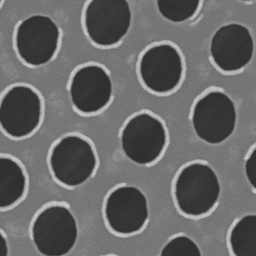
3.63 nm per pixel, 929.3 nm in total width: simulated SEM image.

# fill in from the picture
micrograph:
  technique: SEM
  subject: a regular array of holes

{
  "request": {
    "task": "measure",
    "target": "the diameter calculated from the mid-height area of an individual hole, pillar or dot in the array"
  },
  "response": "0.164 micrometres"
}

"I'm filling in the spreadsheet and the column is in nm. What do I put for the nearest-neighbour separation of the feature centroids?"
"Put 264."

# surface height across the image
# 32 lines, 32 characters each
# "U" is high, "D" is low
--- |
UUUUUUUUUUUDDDDDUUUUDDDDDUUUUUUU
UUUUUUUUUUUDDDDDUUUUDDDDUUUUUUUU
UUUDDDUUUUUDDDDDUUUUUDDUUUUUUUUU
UUDDDDDUUUUDDDDDUUUUUUUUUUUUDDDU
UUDDDDDUUUUDDDDUUUUUUUUUUUUDDDDU
UUDDDDDUUUUUDDUUUUUUUUUUUUDDDDDD
UUDDDDDUUUUUUUUUUUDDDDUUUUDDDDDD
UUUDDDUUUUUUUUUUUUDDDDDUUUUDDDDU
UUUUUUUUUUUDDUUUUUDDDDDUUUUUDDUU
UUUUUUUUUDDDDUUUUUDDDDDUUUUUUUUU
UUUUUUUUUDDDDDUUUUDDDDUUUUUUUUUU
UDDDUUUUUDDDDDUUUUUUUUUUUUUUUUUU
DDDDDUUUUDDDDDUUUUUUUUUUUDDDDUUU
DDDDDUUUUUDDDUUUUUUUUUUUDDDDDUUU
DDDDDUUUUUUUUUUUUDDUUUUUDDDDDUUU
DDDDDUUUUUUUUUUUDDDDUUUUDDDDDUUU
UDDDUUUUUUUUUUUDDDDDDUUUUDDDDUUU
UUUUUUUUDDUUUUUDDDDDDUUUUUDDUUUU
UUUUUUUDDDDUUUUDDDDDUUUUUUUUUUUU
UUUUUUUDDDDDUUUUDDDDUUUUUUUUUUUD
DDUUUUDDDDDDUUUUUUUUUUUUUUUUUUUD
DDDUUUUDDDDUUUUUUUUUUUUDDDDUUUUD
DDDUUUUDDDDUUUUUUUUUUUDDDDDUUUUD
DDDUUUUUUUUUUUUDDUUUUUDDDDDUUUUU
DDDUUUUUUUUUUUDDDDUUUUDDDDDUUUUU
DUUUUUUUUUUUUDDDDDUUUUDDDDDUUUUU
UUUUUDDDDUUUUDDDDDUUUUUDDDUUUUUU
UUUUUDDDDUUUUUDDDDUUUUUUUUUUUUDD
UUUUDDDDDDUUUUDDDUUUUUUUUUUUUDDD
UUUUDDDDDDUUUUUUUUUUUUUUUUUUUDDD
DUUUDDDDDUUUUUUUUUUUUDDDUUUUUDDD
DUUUUDDDUUUUUUUUUUUUDDDDDUUUUDDD